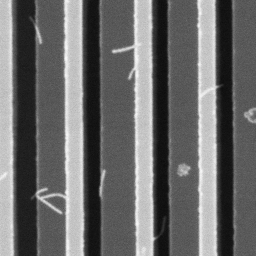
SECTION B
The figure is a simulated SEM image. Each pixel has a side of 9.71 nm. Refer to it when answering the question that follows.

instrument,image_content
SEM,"lines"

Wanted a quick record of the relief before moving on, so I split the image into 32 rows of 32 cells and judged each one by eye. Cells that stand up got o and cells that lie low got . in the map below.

o....ooooo...oooooo..oooooo..ooo
o....ooooo...oooooo..oooooo..ooo
o....ooooo...oooooo..oooooo..ooo
oo..oooooo...oooooo..oooooo..ooo
oo...ooooo...oooooo..oooooo..ooo
oo...ooooo...oooooo..oooooo..ooo
oo...ooooo...oooooo..oooooo..ooo
oo...ooooo...oooooo..oooooo..ooo
oo...ooooo...oooooo..oooooo..ooo
oo...ooooo...oooooo..oooooo..ooo
oo...ooooo...oooooo..oooooo..ooo
oo...ooooo...oooooo..oooooo..ooo
oo...ooooo...oooooo..oooooo..ooo
oo...ooooo...oooooo..oooooo..ooo
oo...ooooo...oooooo..oooooo..ooo
oo...ooooo...oooooo..oooooo..ooo
oo...ooooo...oooooo..oooooo..ooo
oo...ooooo...oooooo..oooooo..ooo
oo...ooooo...oooooo..oooooo..ooo
oo...ooooo...oooooo..oooooo..ooo
oo...ooooo...oooooo..oooooo..ooo
oo...ooooo...oooooo..oooooo..ooo
oo...ooooo...oooooo..oooooo..ooo
oo...ooooo...oooooo..oooooo..ooo
oo...ooooo...oooooo..oooooo..ooo
oo...ooooo...oooooo..oooooo..ooo
oo...ooooo...oooooo..oooooo..ooo
oo...ooooo...oooooo..oooooo..ooo
oo...ooooo...oooooo..oooooo..ooo
oo...ooooo...oooooo..oooooo..ooo
oo...ooooo...oooooo..oooooo..ooo
oo...ooooo...oooooo..oooooo..ooo